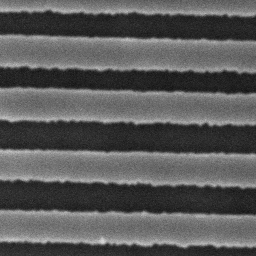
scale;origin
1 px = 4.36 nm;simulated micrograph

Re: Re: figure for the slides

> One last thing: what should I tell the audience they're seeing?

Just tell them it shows lines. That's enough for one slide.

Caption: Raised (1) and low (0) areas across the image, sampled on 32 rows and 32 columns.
11111111111111111111111111111111
00000001111111110111111111111111
00000000000000000000000000000000
00000000000000000000000000000000
11101000000000000000000000000000
11111111111111111111111111111111
11111111111111111111111111111111
11111111111111111111111111111111
00000001001111111111111111111111
00000000000000000000000000000000
00000000000000000000000000000000
11111111111111111000000000000000
11111111111111111111111111111111
11111111111111111111111111111111
11111111111111111111111111111111
00000000000000000000000100111111
00000000000000000000000000000000
00000000000000000000000000000000
00000000000000000000000000000000
11111111111111111111111111111111
11111111111111111111111111111111
11111111111111111111111111111111
00000111111111111111111111111111
00000000000000000000000000000000
00000000000000000000000000000000
00000000000000000000000000000000
11111111100000100000000000000000
11111111111111111111111111111111
11111111111111111111111111111111
11111111111111111111111111111111
00000000000000000110001111111111
00000000000000000000000000000000